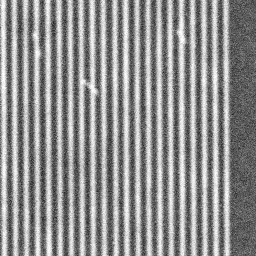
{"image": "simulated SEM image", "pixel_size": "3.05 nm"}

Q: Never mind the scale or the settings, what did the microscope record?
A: parallel lines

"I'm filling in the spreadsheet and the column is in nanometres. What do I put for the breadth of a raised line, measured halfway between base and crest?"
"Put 8.8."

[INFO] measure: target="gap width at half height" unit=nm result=24.8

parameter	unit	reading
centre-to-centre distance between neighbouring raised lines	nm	34